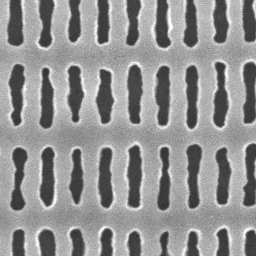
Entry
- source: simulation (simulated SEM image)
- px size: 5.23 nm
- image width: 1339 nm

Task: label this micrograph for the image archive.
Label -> a regular array of holes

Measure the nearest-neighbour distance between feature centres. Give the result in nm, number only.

152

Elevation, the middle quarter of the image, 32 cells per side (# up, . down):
##.##############.#######.#####.
#...#####.######...####....###..
#...#####...####...####...####..
#...#####...####....###...####..
#...#####...####....###...#####.
#....####...####....###...#####.
#....####...####....##....####..
#....###....####....###...#####.
#....###....####...####....####.
#....###....####...####....####.
#...####....####...#####...####.
##..####....####...#####...####.
##..#####...####...####...#####.
##..#####...####...####...#####.
##..#####..######..####...#####.
###############################.
################################
################################
################################
################################
#################..############.
##..#####...####...#####..#####.
##..#####...####...#####..#####.
##..#####...####...#####..#####.
##..#####...####....####..#####.
##...####...####...#####..#####.
##...####...####....####..#####.
##...####...####....####..#####.
##...####...####....####...####.
##...###....####...#####...####.
#....###....####...#####...####.
#....####...####...#####..#####.